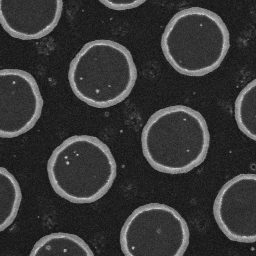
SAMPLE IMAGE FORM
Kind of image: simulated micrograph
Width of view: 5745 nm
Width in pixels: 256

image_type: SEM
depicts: raised bodies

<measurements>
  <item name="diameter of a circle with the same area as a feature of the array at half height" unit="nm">1420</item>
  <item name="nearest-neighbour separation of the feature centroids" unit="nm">2200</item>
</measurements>